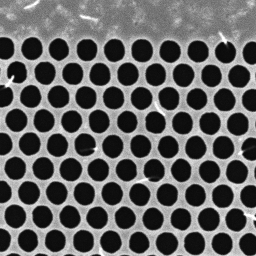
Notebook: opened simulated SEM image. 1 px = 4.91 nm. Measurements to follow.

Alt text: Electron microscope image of a regular array of holes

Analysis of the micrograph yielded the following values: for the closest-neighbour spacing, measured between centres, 134 nm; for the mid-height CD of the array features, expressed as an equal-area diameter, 109 nanometres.